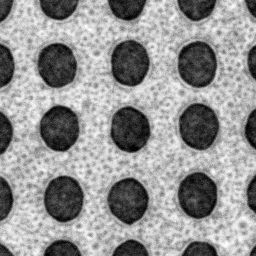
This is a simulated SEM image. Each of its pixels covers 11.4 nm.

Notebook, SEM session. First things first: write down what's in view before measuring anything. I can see a regular array of holes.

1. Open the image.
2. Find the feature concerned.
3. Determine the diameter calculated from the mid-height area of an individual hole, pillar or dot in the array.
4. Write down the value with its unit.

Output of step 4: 507 nanometers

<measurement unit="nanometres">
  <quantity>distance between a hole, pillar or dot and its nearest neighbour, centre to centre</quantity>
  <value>736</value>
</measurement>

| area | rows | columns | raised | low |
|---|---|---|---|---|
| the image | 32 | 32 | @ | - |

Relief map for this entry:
--@@@-----@@@-----@@@@-----@@@@-
-@@@@----@@@@@----@@@@@----@@@@-
-@@@@@@-@@@@@@@--@@@@@@@-@@@@@@@
@@@@@@@@@@@@@@@@@@@@@@@@@@@@@@@@
@@@@@@@@@@@@@@@@@@@@@@@@@@@@@@@@
-@@@@@--@@@@@@@---@@@@@---@@@@@@
-@@@@----@@@@@----@@@@-----@@@@-
--@@@-----@@@@-----@@@-----@@@@-
--@@@-----@@@@-----@@@-----@@@@-
--@@@-----@@@@----@@@@-----@@@@-
-@@@@@---@@@@@@---@@@@@---@@@@@@
@@@@@@@@@@@@@@@@@@@@@@@@@@@@@@@@
@@@@@@@@@@@@@@@@@@@@@@@@@@@@@@@@
@@@@@@---@@@@@@--@@@@@@---@@@@@@
-@@@@-----@@@@----@@@@-----@@@@-
--@@@-----@@@@-----@@@-----@@@@-
--@@@-----@@@@-----@@@-----@@@@-
-@@@@-----@@@@-----@@@@----@@@@-
-@@@@@---@@@@@@---@@@@@@--@@@@@@
@@@@@@@@@@@@@@@@@@@@@@@@@@@@@@@@
@@@@@@@@@@@@@@@@@@@@@@@@@@@@@@@@
@@@@@@@@@@@@@@@@@@@@@@@@-@@@@@@@
-@@@@@----@@@@@--@@@@@@----@@@@-
-@@@@@----@@@@----@@@@-----@@@@-
--@@@-----@@@------@@@-----@@@@-
--@@@-----@@@------@@@-----@@@@-
-@@@@@----@@@@----@@@@@----@@@@@
@@@@@@@--@@@@@@--@@@@@@@@@@@@@@@
@@@@@@@@@@@@@@@@@@@@@@@@@@@@@@@@
@@@@@@@@@@@@@@@@@@@@@@@@@@@@@@@@
@@@@@@---@@@@@@---@@@@@@--@@@@@@
-@@@@@----@@@@----@@@@@----@@@@-